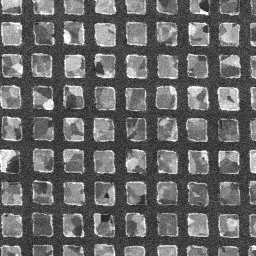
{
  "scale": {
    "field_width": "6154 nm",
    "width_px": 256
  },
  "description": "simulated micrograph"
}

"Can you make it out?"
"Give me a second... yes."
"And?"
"a regular array of raised bodies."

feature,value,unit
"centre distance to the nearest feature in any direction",733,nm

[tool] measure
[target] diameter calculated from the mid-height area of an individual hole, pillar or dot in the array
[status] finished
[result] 558 nm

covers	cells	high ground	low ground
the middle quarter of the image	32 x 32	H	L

HHHHHLLLHHHHHLLLHHHHLLLLHHHHLLLH
HHHHHLLLHHHHHLLLHHHHLLLLHHHHLLLH
HHHHHLLLHHHHHLLLHHHHHLLLHHHHLLLH
LLLLLLLLLLLLLLLLLLLLLLLLLLLLLLLL
LLLLLLLLLLLLLLLLLLLLLLLLLLLLLLLL
LLHLLLLLLLLLLLLLLLLLLLLLLLLLLLLL
HHHHHLLLHHHHHLLLHHHHLLLHHHHHLLLH
HHHHHLLLHHHHHLLHHHHHLLLHHHHHLLLH
HHHHHLLLHHHHHLLLHHHHLLLHHHHHLLLH
HHHHHLLLHHHHHLLLHHHHLLLHHHHHLLLH
HHHHHLLLHHHHHLLLHHHHLLLHHHHHLLLH
LLLLLLLLLLLLLLLLHHLLLLLLLLLLLLLL
LLLLLLLLLLLLLLLLLLLLLLLLLLLLLLLL
LLLLLLLLLLLLLLLLLLLLLLLLLLLLLLLL
HHHHHLLLHHHHLLLLHHHHLLLLHHHHLLLH
HHHHHLLLHHHHLLLLHHHHLLLLHHHHLLLH
HHHHHLLLHHHHLLLLHHHHLLLLHHHHLLLH
HHHHHLLHHHHHLLLLHHHHLLLHHHHHLLLH
HHHHHLLLHHHHLLLLHHHHLLLLHHHHLLLH
LLLLLLLLLLLLLLLLLLLLLLLLLLLLLLLL
LLLLLLLLLLLLLLLLLLLLLLLLLLLLLLLL
LLLLLLLLLLLLLLLLHLLLLLLLLLLLLLLL
HHHHHLLLHHHHLLLHHHHHLLLLHHHHLLLH
HHHHHLLLHHHHLLLHHHHHLLLLHHHHLLLH
LHHHHLLLHHHHLLLLHHHHLLLLHHHHLLLH
HHHHHLLLHHHHHLLLHHHHLLLLHHHHLLLH
HHHHHLLLHHHHHLLLHHHHLLLLHHHHLLLH
LLLLLLLLLLLLLLLLLLLLLLLLLLLLLLLL
LLLLLLLLLLLLLLLLLLLLLLLLLLLLLLLL
LLLLLLLLLLLLLLLLLLLLLLLLLLHLLLLL
HHHHHLLLHHHHLLLLHHHHHLLHHHHHLLLH
HHHHHLLLHHHHLLLLHHHHHLLHHHHHLLLH